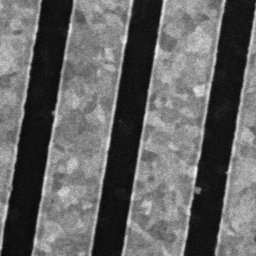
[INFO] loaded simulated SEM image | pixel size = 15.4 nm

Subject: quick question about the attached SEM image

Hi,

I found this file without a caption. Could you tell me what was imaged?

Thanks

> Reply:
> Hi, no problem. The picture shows one or a few lines or trenches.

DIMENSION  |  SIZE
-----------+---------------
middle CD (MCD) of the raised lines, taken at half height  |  896 nanometers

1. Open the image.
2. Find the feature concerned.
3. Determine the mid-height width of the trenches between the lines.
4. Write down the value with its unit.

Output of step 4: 0.498 µm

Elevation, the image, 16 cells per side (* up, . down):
**...***..****..
**..****..****..
**..****..****..
**..****..***...
**..****..***..*
**..***..****..*
*...***..****..*
*..****..****..*
*..****..****..*
*..****..***...*
*..****..***..**
*..***..****..**
...***..****..**
..****..****..**
..****..****..**
..****..***...**